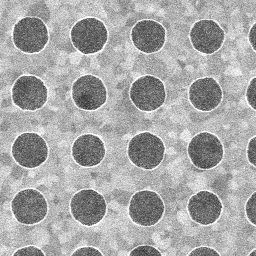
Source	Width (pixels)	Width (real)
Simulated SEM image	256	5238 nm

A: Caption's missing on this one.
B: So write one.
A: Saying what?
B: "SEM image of a regular array of holes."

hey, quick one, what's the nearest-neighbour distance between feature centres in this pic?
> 1170 nanometers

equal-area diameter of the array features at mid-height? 745 nanometres